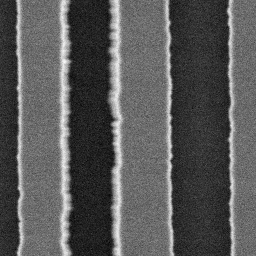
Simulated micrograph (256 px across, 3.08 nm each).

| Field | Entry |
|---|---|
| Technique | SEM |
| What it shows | lines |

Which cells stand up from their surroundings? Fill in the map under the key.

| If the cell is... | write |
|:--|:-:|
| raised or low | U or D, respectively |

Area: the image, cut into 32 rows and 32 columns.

DDUUUUUUDDDDDDUUUUUUUDDDDDDDDUUU
DDUUUUUUDDDDDDUUUUUUUDDDDDDDDUUU
DDUUUUUUDDDDDDDUUUUUUDDDDDDDDUUU
DDUUUUUUDDDDDDDUUUUUUDDDDDDDDUUU
DDUUUUUUDDDDDDUUUUUUUDDDDDDDDUUU
DDUUUUUUDDDDDDDUUUUUUDDDDDDDDUUU
DDUUUUUUDDDDDDUUUUUUUDDDDDDDDUUU
DDUUUUUUDDDDDDDUUUUUUDDDDDDDDUUU
DDUUUUUUDDDDDDUUUUUUUDDDDDDDDUUU
DDUUUUUUDDDDDDDUUUUUUDDDDDDDDUUU
DDUUUUUUDDDDDDDUUUUUUDDDDDDDDUUU
DDUUUUUUDDDDDDDUUUUUUDDDDDDDDUUU
DDUUUUUUDDDDDDUUUUUUUDDDDDDDDUUU
DDUUUUUUDDDDDDDUUUUUUDDDDDDDDUUU
DDUUUUUUDDDDDDDUUUUUUDDDDDDDDUUU
DDUUUUUUDDDDDDDUUUUUUDDDDDDDDUUU
DDUUUUUUDDDDDDDUUUUUUDDDDDDDDUUU
DDUUUUUUDDDDDDDUUUUUUDDDDDDDDUUU
DDUUUUUUDDDDDDDUUUUUUDDDDDDDDUUU
DDUUUUUUDDDDDDDUUUUUUDDDDDDDDUUU
DDUUUUUUDDDDDDDUUUUUUDDDDDDDDUUU
DDUUUUUUDDDDDDDUUUUUUDDDDDDDDUUU
DDUUUUUUDDDDDDDUUUUUUDDDDDDDDUUU
DDUUUUUUDDDDDDDUUUUUUDDDDDDDDUUU
DDDUUUUUDDDDDDDUUUUUUDDDDDDDDUUU
DDUUUUUUDDDDDDDUUUUUUDDDDDDDDUUU
DDUUUUUUDDDDDDDUUUUUUDDDDDDDDUUU
DDUUUUUUDDDDDDDUUUUUUDDDDDDDDUUU
DDUUUUUUDDDDDDDUUUUUUDDDDDDDDUUU
DDDUUUUUDDDDDDDUUUUUUUDDDDDDDUUU
DDUUUUUUDDDDDDDUUUUUUUDDDDDDDUUU
DDUUUUUUDDDDDDDUUUUUUUDDDDDDDUUU